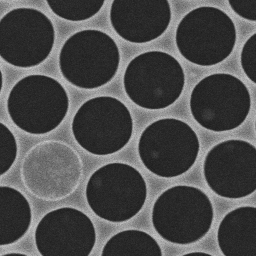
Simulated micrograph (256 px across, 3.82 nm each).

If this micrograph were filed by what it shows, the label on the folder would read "a regular array of holes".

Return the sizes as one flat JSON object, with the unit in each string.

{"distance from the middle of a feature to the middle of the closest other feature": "0.26 micrometres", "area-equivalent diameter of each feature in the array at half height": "0.226 micrometres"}